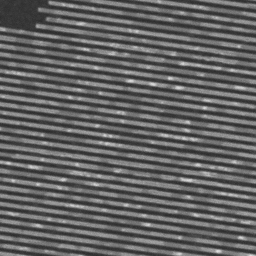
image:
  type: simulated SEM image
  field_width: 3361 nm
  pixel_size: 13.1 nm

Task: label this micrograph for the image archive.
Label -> parallel lines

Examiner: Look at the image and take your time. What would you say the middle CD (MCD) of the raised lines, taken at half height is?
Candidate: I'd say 0.0439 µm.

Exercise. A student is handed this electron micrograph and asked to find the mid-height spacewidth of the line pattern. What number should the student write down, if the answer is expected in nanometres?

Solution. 65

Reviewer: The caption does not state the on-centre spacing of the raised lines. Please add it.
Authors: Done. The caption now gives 108 nanometers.